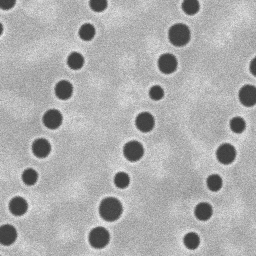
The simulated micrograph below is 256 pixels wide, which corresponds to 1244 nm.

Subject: a regular array of holes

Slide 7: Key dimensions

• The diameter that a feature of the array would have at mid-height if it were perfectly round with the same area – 88.7 nm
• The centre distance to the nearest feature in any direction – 151 nm